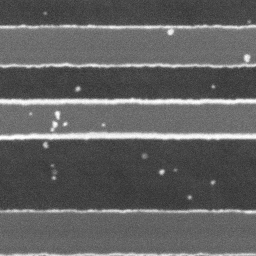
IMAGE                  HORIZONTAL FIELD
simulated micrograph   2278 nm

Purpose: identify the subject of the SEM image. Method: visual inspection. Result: lines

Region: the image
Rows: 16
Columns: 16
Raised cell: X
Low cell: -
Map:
----------------
----------------
XXXXXXXXXXXXXXXX
XXXXXXXXXXXXXXXX
----------------
----------------
XXXXXXXXXXXXXXXX
XXXXXXXXXXXXXXXX
XXXXXXX--XXXXXXX
----------------
----------------
----------------
----------------
XXXXXXXXXXXXXXXX
XXXXXXXXXXXXXXXX
XXXXXXXXXXXXXXXX